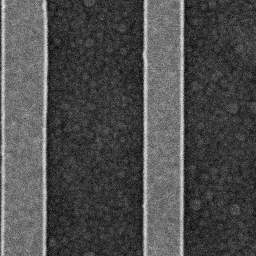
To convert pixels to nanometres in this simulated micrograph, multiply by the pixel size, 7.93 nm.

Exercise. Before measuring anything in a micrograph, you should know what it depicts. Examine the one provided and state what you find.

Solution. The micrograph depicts one or a few lines or trenches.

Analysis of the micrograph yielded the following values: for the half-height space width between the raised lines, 793 nm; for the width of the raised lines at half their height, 313 nm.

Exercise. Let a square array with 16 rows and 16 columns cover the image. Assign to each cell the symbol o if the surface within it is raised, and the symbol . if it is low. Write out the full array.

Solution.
ooo......oo.....
ooo......oo.....
ooo......oo.....
ooo......oo.....
ooo......oo.....
ooo......oo.....
ooo......oo.....
ooo......oo.....
ooo......oo.....
ooo......oo.....
ooo......oo.....
ooo......oo.....
ooo......oo.....
ooo......oo.....
ooo......oo.....
ooo......oo.....